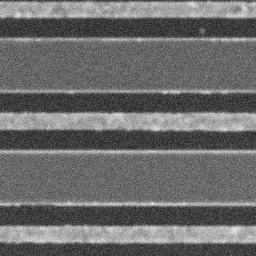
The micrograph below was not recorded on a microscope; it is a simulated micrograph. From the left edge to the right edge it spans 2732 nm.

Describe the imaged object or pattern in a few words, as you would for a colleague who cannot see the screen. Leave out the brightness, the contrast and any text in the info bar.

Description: lines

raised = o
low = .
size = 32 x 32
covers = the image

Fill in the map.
oooooooooooooooooooooooooooooooo
oooooooooooooooooooooooooooooooo
................................
................................
................................
oooooooooooooooooooooooooooooooo
oooooooooooooooooooooooooooooooo
oooooooooooooooooooooooooooooooo
oooooooooooooooooooooooooooooooo
oooooooooooooooooooooooooooooooo
oooooooooooooooooooooooooooooooo
................................
................................
................................
oooooooooooooooooooooooooooooooo
oooooooooooooooooooooooooooooooo
................................
................................
................................
oooooooooooooooooooooooooooooooo
oooooooooooooooooooooooooooooooo
oooooooooooooooooooooooooooooooo
oooooooooooooooooooooooooooooooo
oooooooooooooooooooooooooooooooo
oooooooooooooooooooooooooooooooo
............oo....oooooooooooooo
................................
................................
oooooooooooooooooooooooooooooooo
oooooooooooooooooooooooooooooooo
................................
................................